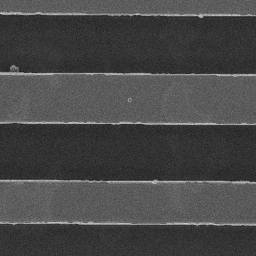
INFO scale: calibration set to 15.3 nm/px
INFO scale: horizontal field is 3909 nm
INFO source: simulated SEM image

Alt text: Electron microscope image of lines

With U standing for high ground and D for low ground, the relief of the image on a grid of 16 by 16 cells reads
UUUUUUUUUUUUUUUU
DDDDDDDDDDDDDDDD
DDDDDDDDDDDDDDDD
DDDDDDDDDDDDDDDD
DDDDDDDDDDDDDDDD
UUUUUUUUUUUUUUUU
UUUUUUUUUUUUUUUU
UUUUUUUUUUUUUUUU
DDDDDDDDDDDDDDDD
DDDDDDDDDDDDDDDD
DDDDDDDDDDDDDDDD
UUUUUUUUUUUUUUUU
UUUUUUUUUUUUUUUU
UUUUUUUUUUUUUUUU
DDDDDDDDDDDDDDDD
DDDDDDDDDDDDDDDD